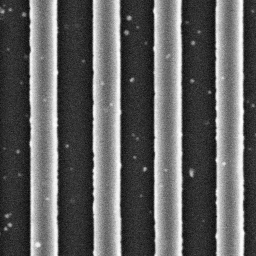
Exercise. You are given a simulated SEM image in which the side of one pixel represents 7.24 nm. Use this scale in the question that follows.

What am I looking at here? lines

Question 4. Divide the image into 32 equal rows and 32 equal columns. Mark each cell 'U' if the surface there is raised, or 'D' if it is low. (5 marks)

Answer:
DDDDUUUDDDDDUUUDDDDUUUDDDDDUUUDD
DDDDUUUDDDDDUUUDDDDUUUDDDDDUUUDD
DDDDUUUDDDDDUUUDDDDUUUDDDDDUUUDD
DDDDUUUDDDDDUUUDDDDUUUDDDDDUUUDD
DDDDUUUDDDDDUUUDDDDUUUDDDDDUUUDD
DDDDUUUDDDDDUUUDDDDUUUDDDDDUUUDD
DDDDUUUDDDDDUUUDDDDUUUDDDDDUUUDD
DDDDUUUDDDDDUUUDDDDUUUDDDDDUUUDD
DDDDUUUDDDDDUUUDDDDUUUDDDDDUUUDD
DDDDUUUDDDDDUUUDDDDUUUDDDDDUUUDD
DDDDUUUDDDDDUUUDDDDUUUDDDDDUUUDD
DDDDUUUDDDDDUUUDDDDUUUDDDDDUUUDD
DDDDUUUDDDDDUUUDDDDUUUDDDDDUUUDD
DDDDUUUDDDDDUUUDDDDUUUDDDDDUUUDD
DDDDUUUDDDDDUUUDDDDUUUDDDDDUUUDD
DDDDUUUDDDDDUUUDDDDUUUDDDDDUUUDD
DDDDUUUDDDDDUUUDDDDUUUUDDDDUUUDD
DDDDUUUDDDDDUUUDDDDUUUDDDDDUUUDD
DDDDUUUDDDDDUUUDDDDUUUDDDDDUUUDD
DDDDUUUDDDDDUUUDDDDUUUUDDDDUUUDD
DDDDUUUDDDDDUUUDDDDUUUDDDDDUUUDD
DDDDUUUDDDDDUUUDDDDUUUDDDDDUUUDD
DDDDUUUDDDDDUUUDDDDUUUUDDDDUUUDD
DDDDUUUDDDDDUUUDDDDUUUDDDDDUUUDD
DDDDUUUDDDDDUUUDDDDUUUDDDDDUUUDD
DDDDUUUDDDDDUUUDDDDUUUUDDDDUUUDD
DDDDUUUDDDDDUUUDDDDUUUUDDDDUUUDD
DDDDUUUDDDDDUUUDDDDUUUUDDDDUUUDD
DDDDUUUDDDDDUUUDDDDDUUUDDDDUUUDD
DDDDUUUDDDDDUUUDDDDDUUUDDDDUUUDD
DDDDUUUDDDDDUUUDDDDDUUUDDDDUUUDD
DDDDUUUDDDDDUUUDDDDDUUUDDDDUUUDD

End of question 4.